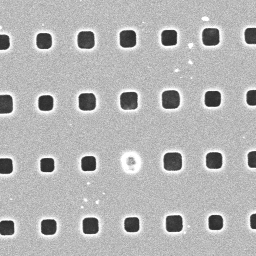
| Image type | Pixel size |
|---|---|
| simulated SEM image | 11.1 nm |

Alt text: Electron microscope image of a regular array of holes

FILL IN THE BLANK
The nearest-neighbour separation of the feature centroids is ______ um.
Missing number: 0.459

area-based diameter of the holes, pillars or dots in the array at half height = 198 nm